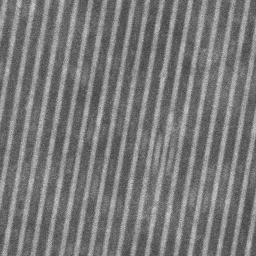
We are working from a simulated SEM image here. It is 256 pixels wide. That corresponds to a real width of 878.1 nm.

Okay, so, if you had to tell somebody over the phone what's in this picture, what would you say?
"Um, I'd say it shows parallel lines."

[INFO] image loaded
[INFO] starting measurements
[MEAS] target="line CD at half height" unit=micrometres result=0.0101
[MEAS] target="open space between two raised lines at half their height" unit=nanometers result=36.4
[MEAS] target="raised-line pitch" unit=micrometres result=0.0483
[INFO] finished